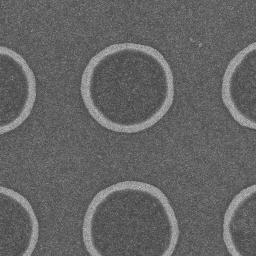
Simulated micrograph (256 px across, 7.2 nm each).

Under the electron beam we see raised bodies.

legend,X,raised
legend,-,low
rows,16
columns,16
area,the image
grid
----------------
----------------
----------------
X-----XXXX-----X
XX---XXXXXX---XX
XX---XXXXXX---XX
XX----XXXX----XX
X-----XXXX-----X
----------------
----------------
----------------
----------------
X-----XXXX-----X
XX----XXXXX---XX
XX---XXXXXX---XX
XX----XXXXX---XX